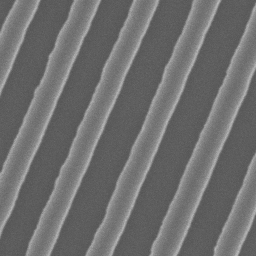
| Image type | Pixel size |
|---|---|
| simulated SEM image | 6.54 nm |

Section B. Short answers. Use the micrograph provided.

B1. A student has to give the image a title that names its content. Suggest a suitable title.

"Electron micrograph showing lines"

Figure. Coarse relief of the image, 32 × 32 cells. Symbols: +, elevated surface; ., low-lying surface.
..+++....+++.....+++....+++.....
.+++.....+++....+++.....+++.....
.+++....++++....+++....++++....+
+++.....+++....+++.....+++.....+
+++....++++....+++.....+++....++
+++....+++....+++.....+++.....++
++....++++....+++.....+++....+++
++....+++....++++....+++.....+++
+.....+++....+++.....+++.....+++
+....+++.....+++....++++....++++
+....+++....+++.....+++.....+++.
....++++....+++.....+++....++++.
....+++....+++.....+++.....+++..
....+++....+++.....+++.....+++..
...+++.....+++....+++.....+++...
...+++....+++.....+++.....+++...
..++++....+++.....+++....++++...
..+++....+++.....+++.....+++....
.++++....+++.....+++....++++....
.+++.....+++....+++.....+++.....
.+++....+++.....+++....++++....+
+++.....+++....+++.....++++....+
+++....+++.....+++.....+++.....+
+++....+++....++++....++++....++
++....+++.....+++.....+++.....++
++....+++.....+++....++++....+++
+....++++....+++.....+++.....+++
+....+++.....+++....++++....++++
.....+++....++++....++++....+++.
....+++.....+++.....+++.....+++.
....+++....++++....++++....+++..
...+++.....+++.....+++.....+++..